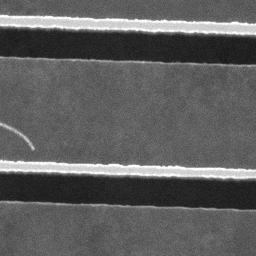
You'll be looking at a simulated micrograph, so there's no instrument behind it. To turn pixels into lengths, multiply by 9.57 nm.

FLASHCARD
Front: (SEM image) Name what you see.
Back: lines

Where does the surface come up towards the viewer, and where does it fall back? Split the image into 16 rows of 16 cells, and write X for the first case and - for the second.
XXXXXXXXXXXXXXXX
XXXXXXXXXXXXXXXX
----------------
----------------
XXXXXXXXXXXXXXXX
XXXXXXXXXXXXXXXX
XXXXXXXXXXXXXXXX
XXXXXXXXXXXXXXXX
XXXXXXXXXXXXXXXX
XXXXXXXXXXXXXXXX
XXXXXXXXXXXXXXXX
----------------
----------------
XXXXXXXXXXXXXXXX
XXXXXXXXXXXXXXXX
XXXXXXXXXXXXXXXX